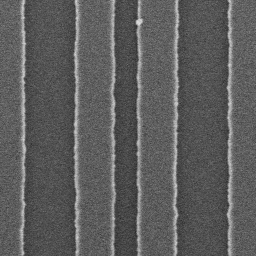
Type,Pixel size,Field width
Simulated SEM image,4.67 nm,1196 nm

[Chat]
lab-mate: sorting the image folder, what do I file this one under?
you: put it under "lines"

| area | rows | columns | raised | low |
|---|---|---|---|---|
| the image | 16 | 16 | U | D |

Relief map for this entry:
UDDDDUUDDUUDDDUU
UUDDDUUDDUUDDDUU
UUDDDUUDDUUDDDUU
UUDDDUUDDUUDDDUU
UUDDDUUDDUUDDDUU
UUDDDUUDDUUDDDUU
UUDDDUUDDUUDDDUU
UUDDDUUDDUUDDDUU
UUDDDUUDDUUDDDUU
UUDDDUUDDUUDDDUU
UUDDDUUDDUUDDDUU
UUDDDUUDDUUDDDUU
UUDDDUUDDUUDDDUU
UDDDDUUDDUUDDDUU
UDDDDUUDDUUDDDUU
UDDDDUUDDUUDDDUU